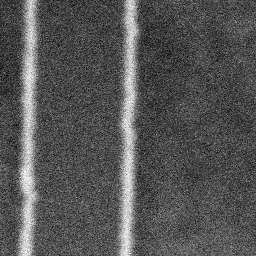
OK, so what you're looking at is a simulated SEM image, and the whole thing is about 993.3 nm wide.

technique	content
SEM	one or a few lines or trenches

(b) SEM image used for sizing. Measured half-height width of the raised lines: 391 nanometres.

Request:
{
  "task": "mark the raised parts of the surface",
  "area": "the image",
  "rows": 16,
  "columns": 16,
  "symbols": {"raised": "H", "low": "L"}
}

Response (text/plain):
LLHHHHHHLLLLLLLL
LLHHHHHHLLLLLLLL
LLHHHHHHLLLLLLLL
LLHHHHHHLLLLLLLL
LLHHHHHHLLLLLLLL
LLHHHHHHLLLLLLLL
LLHHHHHHLLLLLLLL
LLHHHHHHLLLLLLLL
LLHHHHHHLLLLLLLL
LLHHHHHHLLLLLLLL
LLHHHHHHLLLLLLLL
LLHHHHHHLLLLLLLL
LLHHHHHHLLLLLLLL
LLHHHHHHLLLLLLLL
LLHHHHHHLLLLLLLL
LLHHHHHHLLLLLLLL